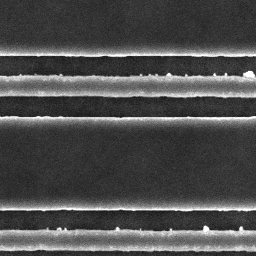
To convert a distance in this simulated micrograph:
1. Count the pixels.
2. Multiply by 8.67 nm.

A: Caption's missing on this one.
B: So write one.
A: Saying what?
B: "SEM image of lines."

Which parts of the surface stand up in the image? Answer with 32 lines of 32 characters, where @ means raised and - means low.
@@@@@@@@@@@@@@@@@@@@@@@@@@@@@@@@
@@@@@@@@@@@@@@@@@@@@@@@@@@@@@@@@
@@@@@@@@@@@@@@@@@@@@@@@@@@@@@@@@
@@@@@@@@@@@@@@@@@@@@@@@@@@@@@@@@
@@@@@@@@@@@@@@@@@@@@@@@@@@@@@@@@
@@@@@@@@@@@@@@@@@@@@@@@@@@@@@@@@
@@@@@@@@@@@@@@@@@@@@@@@@@@@@@@@@
--------------------------------
--------------------------------
-------------------------------@
@@@@@@@@@@@@@@@@@@@@@@@@@@@@@@@@
@@@@@@@@@@@@@@@@@@@@@@@@@@@@@@@@
--------------------------------
--------------------------------
--------------------------------
@@@@@@@@@@@@@@@@@@@@@@@@@@@@@@@@
@@@@@@@@@@@@@@@@@@@@@@@@@@@@@@@@
@@@@@@@@@@@@@@@@@@@@@@@@@@@@@@@@
@@@@@@@@@@@@@@@@@@@@@@@@@@@@@@@@
@@@@@@@@@@@@@@@@@@@@@@@@@@@@@@@@
@@@@@@@@@@@@@@@@@@@@@@@@@@@@@@@@
@@@@@@@@@@@@@@@@@@@@@@@@@@@@@@@@
@@@@@@@@@@@@@@@@@@@@@@@@@@@@@@@@
@@@@@@@@@@@@@@@@@@@@@@@@@@@@@@@@
@@@@@@@@@@@@@@@@@@@@@@@@@@@@@@@@
@@@@@@@@@@@@@@@@@@@@@@@@@@@@@@@@
--------------------------------
--------------------------------
--------------------------------
@@@@@@@@@@@@@@@@@@@@@@@@@@@@@@@@
@@@@@@@@@@@@@@@@@@@@@@@@@@@@@@@@
--------------------------------